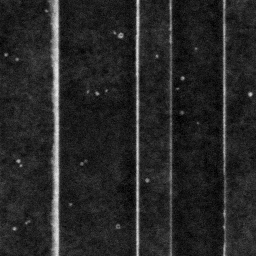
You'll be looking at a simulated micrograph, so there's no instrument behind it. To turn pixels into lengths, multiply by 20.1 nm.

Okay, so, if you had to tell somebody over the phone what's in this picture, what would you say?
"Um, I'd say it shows lines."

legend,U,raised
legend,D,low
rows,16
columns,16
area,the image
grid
UUUDDDDDDUUDDDUU
UUUUDDDDDUUDDDUU
UUUUDDDDDUUDDDUU
UUUUDDDDDUUDDDUU
UUUUDDDDDUUDDDUU
UUUUDDDDDUUDDDUU
UUUUDDDDDUUDDDUU
UUUUDDDDDUUDDDUU
UUUUDDDDDUUDDDUU
UUUUDDDDDUUDDDUU
UUUUDDDDDUUDDDUU
UUUUDDDDDUUDDDUU
UUUUDDDDDUUDDDUU
UUUUDDDDDUUDDDUU
UUUUDDDDDUUDDDUU
UUUUDDDDDUUDDDUU